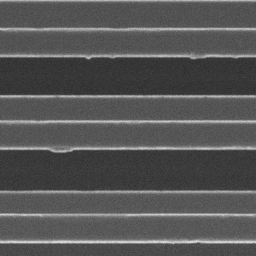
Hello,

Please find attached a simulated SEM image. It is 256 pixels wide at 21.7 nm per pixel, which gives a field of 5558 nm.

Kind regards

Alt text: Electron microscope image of lines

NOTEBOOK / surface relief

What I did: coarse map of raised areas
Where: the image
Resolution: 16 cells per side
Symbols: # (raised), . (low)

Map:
################
################
################
.###############
................
................
################
################
################
................
................
................
################
################
################
................